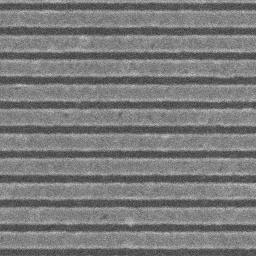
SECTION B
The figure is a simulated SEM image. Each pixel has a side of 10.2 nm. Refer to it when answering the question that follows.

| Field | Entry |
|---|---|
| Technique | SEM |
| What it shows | parallel lines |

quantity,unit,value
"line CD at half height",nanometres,164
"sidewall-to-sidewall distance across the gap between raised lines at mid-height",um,0.0825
